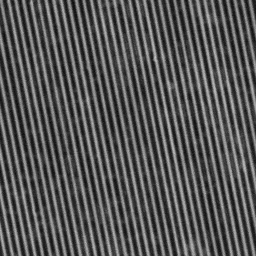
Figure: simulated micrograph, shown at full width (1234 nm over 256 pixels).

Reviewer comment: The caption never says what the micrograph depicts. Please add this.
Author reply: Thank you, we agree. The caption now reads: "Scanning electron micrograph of parallel lines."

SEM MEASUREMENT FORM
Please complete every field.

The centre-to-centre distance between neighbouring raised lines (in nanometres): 35.7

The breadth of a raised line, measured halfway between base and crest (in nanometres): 13.5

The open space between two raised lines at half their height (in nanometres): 23.1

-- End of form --